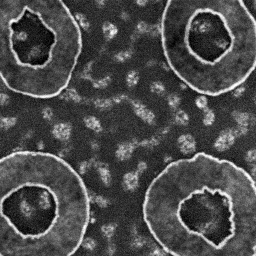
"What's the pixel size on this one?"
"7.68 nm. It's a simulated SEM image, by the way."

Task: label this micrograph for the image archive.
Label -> ring-shaped raised bodies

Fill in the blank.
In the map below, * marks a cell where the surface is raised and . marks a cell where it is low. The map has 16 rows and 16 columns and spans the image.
****......*****.
*..**.....**..**
*..**.....**..**
*..**.....**..**
****.......*****
.***........**..
................
................
................
................
****......*****.
*****....*******
...***...***..**
...***...**...**
*..**.....**..**
*****.....******